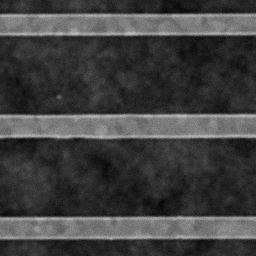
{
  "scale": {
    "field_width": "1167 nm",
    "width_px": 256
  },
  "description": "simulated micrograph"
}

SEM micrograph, one or a few lines or trenches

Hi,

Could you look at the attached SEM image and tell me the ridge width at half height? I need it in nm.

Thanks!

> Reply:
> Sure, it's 92.9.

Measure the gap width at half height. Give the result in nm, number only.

369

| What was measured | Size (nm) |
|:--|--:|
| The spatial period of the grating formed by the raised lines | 464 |